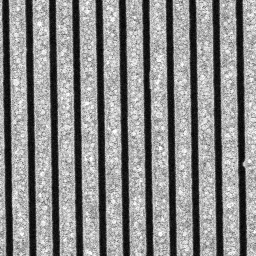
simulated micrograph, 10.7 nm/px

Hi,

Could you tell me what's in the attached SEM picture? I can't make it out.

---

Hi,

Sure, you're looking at parallel lines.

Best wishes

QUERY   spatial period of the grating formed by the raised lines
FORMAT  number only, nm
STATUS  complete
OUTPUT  250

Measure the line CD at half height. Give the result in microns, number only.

0.188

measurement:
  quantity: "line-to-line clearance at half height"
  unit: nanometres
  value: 62.8